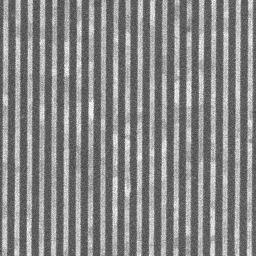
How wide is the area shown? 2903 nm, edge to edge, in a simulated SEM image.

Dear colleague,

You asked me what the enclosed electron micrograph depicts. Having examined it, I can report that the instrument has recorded parallel lines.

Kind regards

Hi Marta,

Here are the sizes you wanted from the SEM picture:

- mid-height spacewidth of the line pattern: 93.6 nm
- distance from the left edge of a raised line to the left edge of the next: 139 nanometres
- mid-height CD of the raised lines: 43.9 nanometers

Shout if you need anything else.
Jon